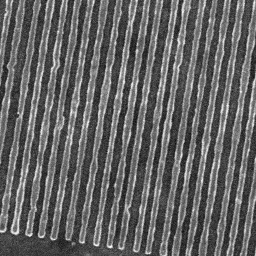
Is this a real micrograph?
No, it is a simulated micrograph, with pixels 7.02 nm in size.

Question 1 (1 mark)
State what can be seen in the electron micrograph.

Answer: parallel lines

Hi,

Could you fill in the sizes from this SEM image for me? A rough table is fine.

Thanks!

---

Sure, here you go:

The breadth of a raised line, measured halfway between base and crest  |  39.8 nanometres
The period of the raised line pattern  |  95 nm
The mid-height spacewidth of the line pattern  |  7.66 pixels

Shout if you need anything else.